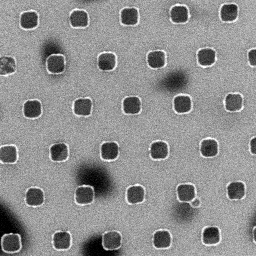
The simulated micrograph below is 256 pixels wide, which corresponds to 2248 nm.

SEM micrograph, a regular array of raised bodies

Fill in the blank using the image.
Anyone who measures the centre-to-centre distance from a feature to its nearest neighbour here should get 436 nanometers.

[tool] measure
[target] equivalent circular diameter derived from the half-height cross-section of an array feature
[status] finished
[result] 178 nanometres